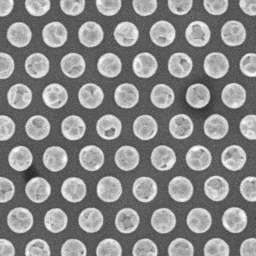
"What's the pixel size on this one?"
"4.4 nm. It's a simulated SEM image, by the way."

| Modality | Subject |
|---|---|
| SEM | a regular array of raised bodies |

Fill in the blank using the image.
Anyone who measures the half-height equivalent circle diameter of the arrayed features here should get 0.105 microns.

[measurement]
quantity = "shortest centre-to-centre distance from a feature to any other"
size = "155 nm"